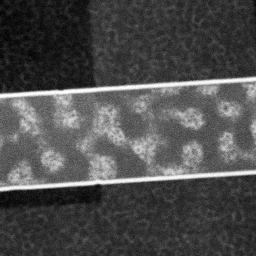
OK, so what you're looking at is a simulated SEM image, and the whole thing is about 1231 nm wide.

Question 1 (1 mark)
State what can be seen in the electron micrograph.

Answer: one or a few lines or trenches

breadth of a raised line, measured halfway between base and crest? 450 nm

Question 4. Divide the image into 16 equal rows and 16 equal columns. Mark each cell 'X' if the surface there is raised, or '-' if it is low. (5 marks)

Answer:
----------------
----------------
----------------
----------------
----------------
-------XXXXXXXXX
XXXXXXXXXXXXXXXX
XXXXXXXXXXXXXXXX
XXXXXXXXXXXXXXXX
XXXXXXXXXXXXXXXX
XXXXXXXXXXXXXXXX
XXXXX-----------
----------------
----------------
----------------
----------------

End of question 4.